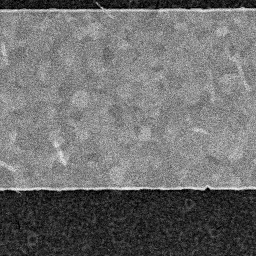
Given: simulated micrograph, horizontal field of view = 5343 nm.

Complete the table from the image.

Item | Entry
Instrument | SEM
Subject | one or a few lines or trenches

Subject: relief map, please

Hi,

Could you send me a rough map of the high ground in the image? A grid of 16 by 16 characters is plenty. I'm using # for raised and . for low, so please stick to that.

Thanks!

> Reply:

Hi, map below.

................
################
################
################
################
################
################
################
################
################
################
################
................
................
................
................